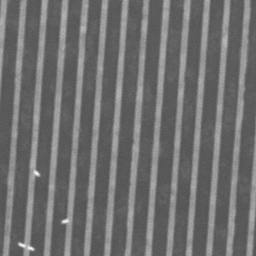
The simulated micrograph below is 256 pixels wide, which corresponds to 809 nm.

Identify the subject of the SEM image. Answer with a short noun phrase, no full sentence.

parallel lines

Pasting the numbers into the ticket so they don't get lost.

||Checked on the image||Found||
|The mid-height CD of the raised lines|12.2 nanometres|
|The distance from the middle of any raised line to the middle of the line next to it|0.064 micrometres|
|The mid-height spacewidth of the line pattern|51.9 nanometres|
